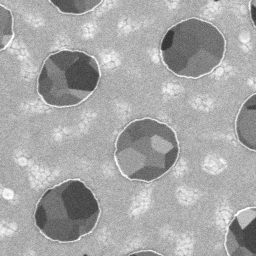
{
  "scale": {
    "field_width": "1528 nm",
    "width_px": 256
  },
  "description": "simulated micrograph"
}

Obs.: raised bodies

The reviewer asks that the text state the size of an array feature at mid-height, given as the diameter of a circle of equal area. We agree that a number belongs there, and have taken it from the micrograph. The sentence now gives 373 nm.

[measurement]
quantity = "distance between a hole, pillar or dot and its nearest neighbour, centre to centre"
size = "103 pixels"